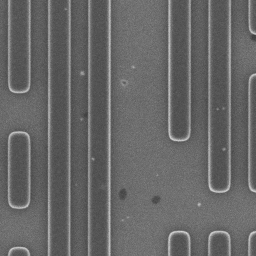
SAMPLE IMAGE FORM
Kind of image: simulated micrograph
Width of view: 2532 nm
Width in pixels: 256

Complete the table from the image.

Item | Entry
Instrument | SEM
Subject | groups of lines, slits or small figures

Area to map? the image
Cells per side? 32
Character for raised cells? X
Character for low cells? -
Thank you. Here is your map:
-XXX--XXX--XXX-------XXX--XXX--X
-XXX--XXX--XXX-------XXX--XXX--X
-XXX--XXX--XXX-------XXX--XXX--X
-XXX--XXX--XXX-------XXX--XXX--X
-XXX--XXX--XXX-------XXX--XXX---
-XXX--XXX--XXX-------XXX--XXX---
-XXX--XXX--XXX-------XXX--XXX---
-XXX--XXX--XXX-------XXX--XXX---
-XXX--XXX--XXX-------XXX--XXX---
-XXX--XXX--XXX-------XXX--XXX---
-XXX--XXX--XXX-------XXX--XXX--X
--X---XXX--XXX-------XXX--XXX--X
------XXX--XXX-------XXX--XXX--X
------XXX--XXX-------XXX--XXX--X
------XXX--XXX-------XXX--XXX--X
------XXX--XXX-------XXX--XXX--X
------XXX--XXX-------XXX--XXX--X
-XXX--XXX--XXX--------X---XXX--X
-XXX--XXX--XXX------------XXX--X
-XXX--XXX--XXX------------XXX--X
-XXX--XXX--XXX------------XXX--X
-XXX--XXX--XXX------------XXX--X
-XXX--XXX--XXX------------XXX--X
-XXX--XXX--XXX------------XXX--X
-XXX--XXX--XXX------------------
-XX---XXX--XXX------------------
------XXX--XXX------------------
------XXX--XXX------------------
------XXX--XXX------------------
------XXX--XXX-------XXX--XXX--X
------XXX--XXX-------XXX--XXX--X
-XXX--XXX--XXX-------XXX--XXX--X